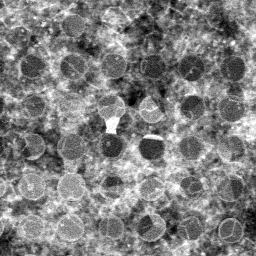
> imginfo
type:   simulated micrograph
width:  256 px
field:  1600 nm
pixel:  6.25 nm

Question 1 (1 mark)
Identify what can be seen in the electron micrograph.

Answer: a regular array of raised bodies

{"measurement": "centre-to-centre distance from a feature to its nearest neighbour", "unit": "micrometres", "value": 0.244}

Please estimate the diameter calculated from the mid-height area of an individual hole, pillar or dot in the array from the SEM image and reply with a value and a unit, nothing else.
25.3 px